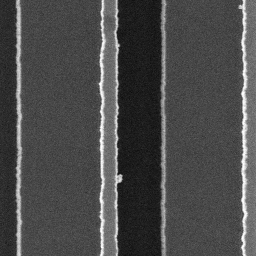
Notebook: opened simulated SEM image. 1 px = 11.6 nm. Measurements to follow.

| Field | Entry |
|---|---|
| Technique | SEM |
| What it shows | lines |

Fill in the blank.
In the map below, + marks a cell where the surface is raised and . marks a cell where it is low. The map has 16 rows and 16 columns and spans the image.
.++++++...++++++
.++++++...++++++
.++++++...++++++
.++++++...++++++
.++++++...++++++
.++++++...++++++
.++++++...++++++
.++++++...++++++
.++++++...++++++
.++++++...++++++
.++++++...++++++
.++++++...++++++
.++++++...++++++
.++++++...++++++
.++++++...++++++
.++++++...++++++